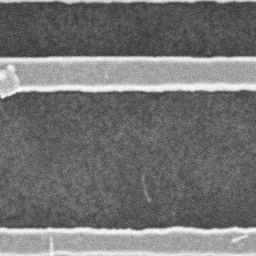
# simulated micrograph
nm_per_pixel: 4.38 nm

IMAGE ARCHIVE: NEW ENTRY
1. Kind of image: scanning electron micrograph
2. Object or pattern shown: lines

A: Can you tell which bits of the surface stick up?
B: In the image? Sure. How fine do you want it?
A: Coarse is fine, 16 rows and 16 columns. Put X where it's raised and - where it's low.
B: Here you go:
----------------
----------------
----------------
----------------
XXXXXXXXXXXXXXXX
XXXXXXXXXXXXXXXX
----------------
----------------
----------------
----------------
----------------
----------------
----------------
----------------
XXXXXXXXXXXXXXXX
XXXXXXXXXXXXXXXX